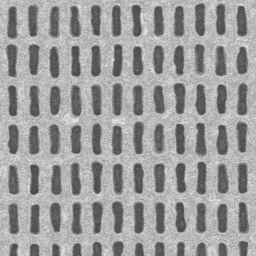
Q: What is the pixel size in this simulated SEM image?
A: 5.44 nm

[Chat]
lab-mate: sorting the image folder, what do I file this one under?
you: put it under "a regular array of holes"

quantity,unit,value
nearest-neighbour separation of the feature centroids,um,0.113